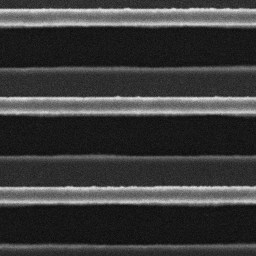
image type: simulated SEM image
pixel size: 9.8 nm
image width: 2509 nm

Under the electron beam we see lines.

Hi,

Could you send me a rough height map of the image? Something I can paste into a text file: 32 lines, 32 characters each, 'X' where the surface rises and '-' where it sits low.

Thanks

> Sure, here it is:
XXXXXXXXXXXXXXXXXXXXXXXXXXXXXXXX
XXXXXXXXXXXXXXXXXXXXXXXXXXXXXXXX
XXXXXXXXXXXXXXXXXXXXXXXXXXXXXXXX
--------------------------------
--------------------------------
--------------------------------
--------------------------------
--------------------------------
--------------------------------
XXXXXXXXXXXXXXXXXXXXXXXXXXXXXXXX
XXXXXXXXXXXXXXXXXXXXXXXXXXXXXXXX
XXXXXXXXXXXXXXXXXXXXXXXXXXXXXXXX
XXXXXXXXXXXXXXXXXXXXXXXXXXXXXXXX
XXXXXXXXXXXXXXXXXXXXXXXXXXXXXXXX
--------------------------------
--------------------------------
--------------------------------
--------------------------------
--------------------------------
--------------------------------
XXXXXXXXXXXXXXXXXXXXXXXXXXXXXXXX
XXXXXXXXXXXXXXXXXXXXXXXXXXXXXXXX
XXXXXXXXXXXXXXXXXXXXXXXXXXXXXXXX
XXXXXXXXXXXXXXXXXXXXXXXXXXXXXXXX
XXXXXXXXXXXXXXXXXXXXXXXXXXXXXXXX
--------------------------------
--------------------------------
--------------------------------
--------------------------------
--------------------------------
--------------------------------
XXXXXXXXXXXXXXXXXXXXXXXXXXXXXXXX